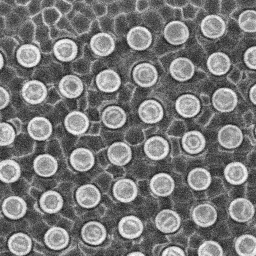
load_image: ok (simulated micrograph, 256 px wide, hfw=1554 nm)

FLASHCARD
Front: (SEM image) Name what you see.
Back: a regular array of raised bodies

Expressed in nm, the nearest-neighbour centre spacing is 224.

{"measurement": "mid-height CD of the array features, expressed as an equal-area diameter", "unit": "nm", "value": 136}